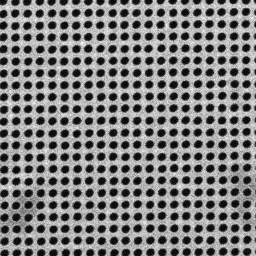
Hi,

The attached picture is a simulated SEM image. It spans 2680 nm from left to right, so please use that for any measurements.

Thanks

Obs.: a regular array of holes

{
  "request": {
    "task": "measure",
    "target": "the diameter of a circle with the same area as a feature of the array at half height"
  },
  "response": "87.6 nm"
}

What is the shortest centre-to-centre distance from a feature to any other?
122 nm